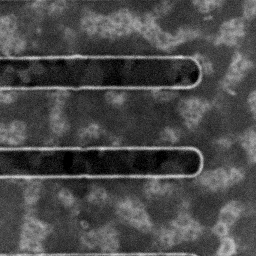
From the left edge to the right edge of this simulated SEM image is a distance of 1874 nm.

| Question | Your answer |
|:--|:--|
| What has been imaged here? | one or a few lines or trenches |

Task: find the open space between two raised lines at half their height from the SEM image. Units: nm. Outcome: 470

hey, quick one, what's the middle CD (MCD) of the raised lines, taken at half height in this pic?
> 213 nm